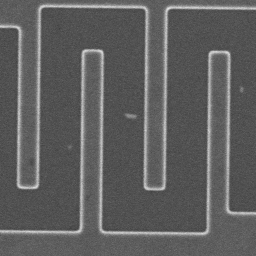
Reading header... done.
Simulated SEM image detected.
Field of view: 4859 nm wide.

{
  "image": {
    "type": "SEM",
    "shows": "groups of lines, slits or small figures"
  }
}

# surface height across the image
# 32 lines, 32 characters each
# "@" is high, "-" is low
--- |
@@@@@@@@@@@@@@@@@@@@@@@@@@@@@@@@
@@@@@-------------@@@-----------
@@@@@-------------@@@-----------
--@@@-------------@@@-----------
---@@-------------@@@-----------
---@@-------------@@@-----------
--@@@------@@-----@@@-----------
--@@@-----@@@-----@@@-----@@@---
--@@@-----@@@-----@@@-----@@@---
--@@@-----@@@-----@@@-----@@@---
--@@@-----@@@-----@@@-----@@@---
--@@@-----@@@-----@@@-----@@@---
--@@@-----@@@-----@@@-----@@@---
--@@@-----@@@-----@@@-----@@@---
--@@@-----@@@-----@@@-----@@@---
--@@@-----@@@-----@@@-----@@@---
--@@@-----@@@-----@@@-----@@@---
--@@@-----@@@-----@@@-----@@----
--@@@-----@@@-----@@@-----@@----
--@@@-----@@@-----@@@-----@@----
--@@@-----@@@-----@@@-----@@----
--@@@-----@@@-----@@@-----@@----
--@@@-----@@@-----@@@-----@@----
----------@@@-----@@------@@----
----------@@@-------------@@----
----------@@@-------------@@----
----------@@@-------------@@@---
----------@@@-------------@@@@@@
----------@@@-------------@@@@@@
@@@@@@@@@@@@@@@@@@@@@@@@@@@@@@@@
@@@@@@@@@@@@@@@@@@@@@@@@@@@@@@@@
@@@@@@@@@@@@@@@@@@@@@@@@@@@@@@@@